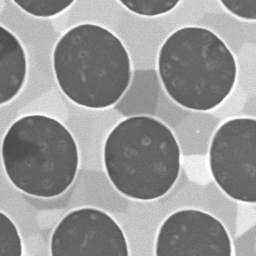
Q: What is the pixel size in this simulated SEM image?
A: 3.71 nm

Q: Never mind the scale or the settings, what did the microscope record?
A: holes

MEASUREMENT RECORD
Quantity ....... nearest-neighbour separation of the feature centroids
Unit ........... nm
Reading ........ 382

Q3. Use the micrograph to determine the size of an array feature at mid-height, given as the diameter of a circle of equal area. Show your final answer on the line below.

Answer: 293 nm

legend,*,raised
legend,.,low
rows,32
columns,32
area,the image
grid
**.......******.......******....
****...**********....********...
********************************
*********....**********..*******
..******......*******......*****
..*****........*****........****
...****.........****.........***
...****.........****.........***
...****.........****.........***
...****.........****.........***
...****.........*****........***
..******.......******........***
.********......*******......****
************************...*****
****..**************************
**......*******.....********....
*........*****.......******.....
.........****.........*****.....
..........***.........****......
..........***.........****......
*.........***.........****......
*........****.........****......
*........*****........*****.....
**......*******......*******....
*****.**********....*********...
********************************
*********....*********...*******
.*******......*******......*****
..*****........*****........****
..*****........*****........****
...***..........****.........***
...***..........***..........***